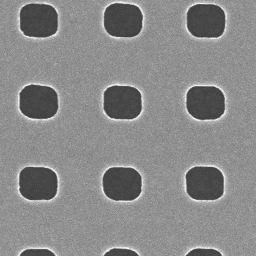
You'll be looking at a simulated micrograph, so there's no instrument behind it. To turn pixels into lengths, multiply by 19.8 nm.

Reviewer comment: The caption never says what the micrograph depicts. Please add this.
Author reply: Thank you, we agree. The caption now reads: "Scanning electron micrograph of a regular array of holes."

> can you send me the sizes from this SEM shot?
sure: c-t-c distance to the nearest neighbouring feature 1610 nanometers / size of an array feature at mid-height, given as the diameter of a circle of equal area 38.5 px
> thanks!